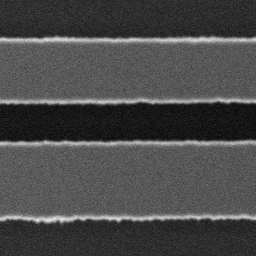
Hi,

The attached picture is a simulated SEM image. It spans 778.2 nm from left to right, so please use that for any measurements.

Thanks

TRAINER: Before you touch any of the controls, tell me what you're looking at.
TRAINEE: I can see lines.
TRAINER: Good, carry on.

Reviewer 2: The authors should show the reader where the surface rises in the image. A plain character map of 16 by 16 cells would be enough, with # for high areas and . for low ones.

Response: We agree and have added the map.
................
................
################
################
################
################
................
................
................
################
################
################
################
################
................
................